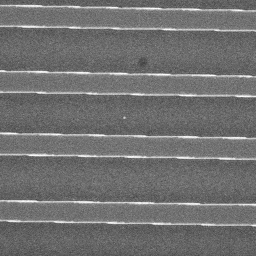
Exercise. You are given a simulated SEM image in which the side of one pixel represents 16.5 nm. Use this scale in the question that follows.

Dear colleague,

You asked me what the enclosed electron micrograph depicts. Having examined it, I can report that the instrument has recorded lines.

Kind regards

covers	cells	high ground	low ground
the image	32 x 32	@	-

--------------------------------
@@@@@@@@@@@@@@@@@@@@@@@@@@@@@@@@
@@@@@@@@@@@@@@@@@@@@@@@@@@@@@@@@
--------------@@@@@@@@@@@@@@@@@@
--------------------------------
--------------------------------
--------------------------------
--------------------------------
--------------------------------
@@@@@@@@@@@@@@@@@@@@@@@@@@@-----
@@@@@@@@@@@@@@@@@@@@@@@@@@@@@@@@
----@@@@@@@@@@@@@@@@@@@@@@@@@@@@
--------------------------------
--------------------------------
--------------------------------
--------------------------------
--------------------------------
@@@@@@@@@@@@@@@@@@@@@@@@@@@@@@@@
@@@@@@@@@@@@@@@@@@@@@@@@@@@@@@@@
----------@@@@@@@@@@@@@@@@@@@@@@
--------------------------------
--------------------------------
--------------------------------
--------------------------------
--------------------------------
@@@@@@@@@@@@@@@@@@@@@@@@@-------
@@@@@@@@@@@@@@@@@@@@@@@@@@@@@@@@
@@@@@@@@@@@@@@@@@@@@@@@@@@@@@@@@
--------------------------------
--------------------------------
--------------------------------
--------------------------------